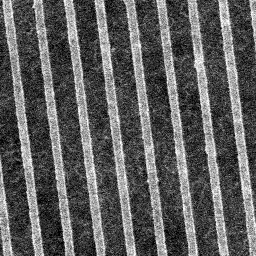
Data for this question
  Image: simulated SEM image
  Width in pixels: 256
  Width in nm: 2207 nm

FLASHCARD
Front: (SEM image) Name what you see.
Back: parallel lines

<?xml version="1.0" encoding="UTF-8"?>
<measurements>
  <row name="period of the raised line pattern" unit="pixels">30.6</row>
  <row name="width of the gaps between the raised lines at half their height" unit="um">0.198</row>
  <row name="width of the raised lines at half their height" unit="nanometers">66.3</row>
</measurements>